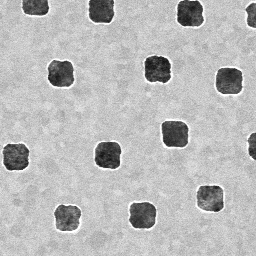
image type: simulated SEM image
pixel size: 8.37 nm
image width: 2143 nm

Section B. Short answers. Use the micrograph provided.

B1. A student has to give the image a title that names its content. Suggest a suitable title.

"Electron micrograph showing a regular array of holes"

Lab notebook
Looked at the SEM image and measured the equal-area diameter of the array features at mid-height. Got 245 nanometers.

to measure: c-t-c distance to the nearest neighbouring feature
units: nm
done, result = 583